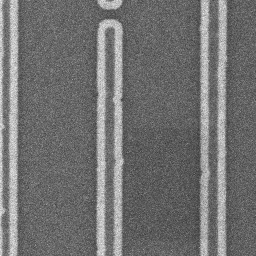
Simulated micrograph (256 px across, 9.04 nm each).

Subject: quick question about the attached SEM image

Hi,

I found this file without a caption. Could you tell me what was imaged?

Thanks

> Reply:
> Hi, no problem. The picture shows one or a few lines or trenches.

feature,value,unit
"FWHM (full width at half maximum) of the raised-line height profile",154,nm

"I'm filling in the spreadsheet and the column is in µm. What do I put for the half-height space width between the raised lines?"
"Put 0.795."